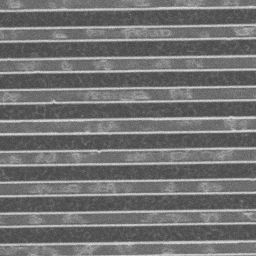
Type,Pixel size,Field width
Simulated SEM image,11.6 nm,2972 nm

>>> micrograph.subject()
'parallel lines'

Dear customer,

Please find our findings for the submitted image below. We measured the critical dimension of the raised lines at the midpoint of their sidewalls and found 209 nm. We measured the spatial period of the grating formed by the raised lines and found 358 nanometers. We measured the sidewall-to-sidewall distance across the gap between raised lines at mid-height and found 0.148 micrometres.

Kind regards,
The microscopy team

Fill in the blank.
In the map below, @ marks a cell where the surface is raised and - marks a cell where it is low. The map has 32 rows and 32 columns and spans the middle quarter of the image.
--------------------------------
--------------------------------
@@@@@@@@@@@@@@@@@@@@@@@@@@@@@@@@
@@@@@@@@@@@@@@@@@@@@@@@@@@@@@@@@
@@@@@@@@@@@@@@@@@@@@@@@@@@@@@@@@
@@@@@@@@@@@@@@@@@@@@@@@@@@@@@@@@
--------------------------------
--------------------------------
--------------------------------
---------------@@@@@@@@@@@@@@@@@
@@@@@@@@@@@@@@@@@@@@@@@@@@@@@@@@
@@@@@@@@@@@@@@@@@@@@@@@@@@@@@@@@
@@@@@@@@@@@@@@@@@@@@@@@@@@@@@@@@
@@@@@@@@@@@@@@@@@@@@@@@@@@@@@@@@
--------------------------------
--------------------------------
--------------------------------
----@@@@@@@@@@@@@@@@@@@@@@@@@@@@
@@@@@@@@@@@@@@@@@@@@@@@@@@@@@@@@
@@@@@@@@@@@@@@@@@@@@@@@@@@@@@@@@
@@@@@@@@@@@@@@@@@@@@@@@@@@@@@@@@
@@@@@@@@@@@@@@@@@@@@@-----------
--------------------------------
--------------------------------
--------------------------------
@@@@@@@@@@@@@@@@@@@@@@@@@@@@@@@@
@@@@@@@@@@@@@@@@@@@@@@@@@@@@@@@@
@@@@@@@@@@@@@@@@@@@@@@@@@@@@@@@@
@@@@@@@@@@@@@@@@@@@@@@@@@@@@@@@@
--------------------------------
--------------------------------
--------------------------------